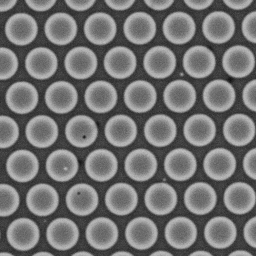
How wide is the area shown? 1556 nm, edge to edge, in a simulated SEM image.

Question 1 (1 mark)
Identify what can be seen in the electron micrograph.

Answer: an array of small figures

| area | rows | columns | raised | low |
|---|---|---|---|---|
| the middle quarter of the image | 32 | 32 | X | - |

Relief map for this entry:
XXXXXXXX--XXXXXXXX--XXXXXXXX--XX
-XXXXXXX---XXXXXXX--XXXXXXX---XX
-XXXXXX----XXXXXX----XXXXXX----X
---XXX-------XX-----------------
X-------XX-------XXXX------XXXX-
XX----XXXXXX----XXXXXX----XXXXXX
XXX---XXXXXXX--XXXXXXXX--XXXXXXX
XXX--XXXXXXXX--XXXXXXXX--XXXXXXX
XXX--XXXXXXXX--XXXXXXXX--XXXXXXX
XXX--XXXXXXXX--XXXXXXXX--XXXXXXX
XXX---XXXXXX----XXXXXX----XXXXXX
XX-----XXXX------XXXX------XXXX-
--------------------------------
--XXXX------XXXXX-----XXXXX----X
-XXXXXXX---XXXXXXX---XXXXXX----X
-XXXXXXX--XXXXXXXX--XXXXXXXX--XX
XXXXXXXX--XXXXXXXX--XXXXXXXX--XX
XXXXXXXX--XXXXXXXX--XXXXXXXX--XX
-XXXXXXX---XXXXXXX--XXXXXXXX--XX
-XXXXXX----XXXXXX----XXXXXX----X
---XXX-------XX--------XX-------
--------XX--------XXX------XXXX-
XX-----XXXXX----XXXXXX----XXXXXX
XXX---XXXXXXX---XXXXXXX--XXXXXXX
XXX--XXXXXXXX--XXXXXXXX--XXXXXXX
XXX--XXXXXXXX--XXXXXXXX--XXXXXXX
XXX---XXXXXXX--XXXXXXXX--XXXXXXX
XXX---XXXXXXX---XXXXXX----XXXXXX
XX-----XXXXX-----XXXXX-----XXXX-
--------------------------------
--XXXXX-----XXXXX-----XXXXX-----
-XXXXXXX---XXXXXXX---XXXXXX----X